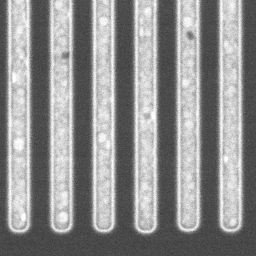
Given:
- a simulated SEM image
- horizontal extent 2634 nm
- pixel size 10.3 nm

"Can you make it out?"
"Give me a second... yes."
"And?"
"parallel lines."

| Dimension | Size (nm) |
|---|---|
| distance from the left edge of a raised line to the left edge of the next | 435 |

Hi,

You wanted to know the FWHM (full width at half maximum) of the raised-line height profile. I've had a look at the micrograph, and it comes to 253 nm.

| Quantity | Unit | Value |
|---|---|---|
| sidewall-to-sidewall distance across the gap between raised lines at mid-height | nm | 180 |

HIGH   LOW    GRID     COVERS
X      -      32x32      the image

X--XXX---XXX--XXX--XXX---XXX--XX
X--XXX---XXX--XXX--XXX---XXX--XX
X--XXX---XXX--XXX--XXX---XXX--XX
X--XXX---XXX--XXX--XXX---XXX--XX
X--XXXX--XXX--XXX--XXX---XXX--XX
X--XXXX--XXX--XXX--XXX---XXX--XX
X---XXX--XXX--XXX--XXX---XXX--XX
X--XXXX--XXX--XXX--XXX---XXX--XX
X--XXXX--XXX--XXX--XXX---XXX--XX
X--XXXX--XXX--XXX--XXX---XXX--XX
X--XXXX--XXX--XXX--XXXX--XXX--XX
X--XXXX--XXX--XXX--XXX---XXX--XX
X--XXXX--XXX--XXX--XXX---XXX--XX
X--XXXX--XXX--XXX--XXX---XXX--XX
X--XXXX--XXX--XXX--XXX---XXX--XX
X--XXXX--XXX--XXX--XXX---XXX--XX
X--XXXX--XXX--XXX--XXX---XXX--XX
X--XXXX--XXX--XXX--XXX---XXX--XX
X--XXXX--XXX--XXX--XXX---XXX--XX
X--XXXX--XXX--XXX--XXX---XXX--XX
X--XXXX--XXX--XXX--XXX---XXX--XX
X--XXXX--XXX--XXX--XXX---XXX--XX
X--XXXX--XXX--XXX--XXX---XXX--XX
X--XXXX--XXX--XXX--XXX---XXX--XX
X--XXXX--XXX--XXX--XXX---XXX--XX
X--XXXX--XXX--XXX--XXX---XXX--XX
X--XXXX--XXX--XXX--XXX---XXX--XX
X--XXXX--XXX--XXX--XXX---XXX--XX
XX-XXXX-XXXX--XXX--XXXX-XXXX--XX
XXXXXXXXXXXXXXXXXXXXXXXXXXXXXXXX
XXXXXXXXXXXXXXXXXXXXXXXXXXXXXXXX
XXXXXXXXXXXXXXXXXXXXXXXXXXXXXXXX